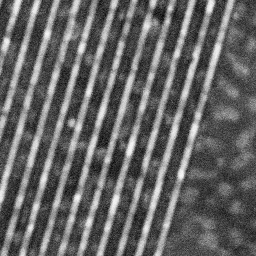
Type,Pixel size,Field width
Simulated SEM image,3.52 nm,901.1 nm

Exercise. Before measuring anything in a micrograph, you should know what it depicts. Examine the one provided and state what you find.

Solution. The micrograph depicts parallel lines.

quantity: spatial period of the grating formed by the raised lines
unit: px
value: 18.6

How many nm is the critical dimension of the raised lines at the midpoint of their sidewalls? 13.6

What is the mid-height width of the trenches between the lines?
0.0512 µm